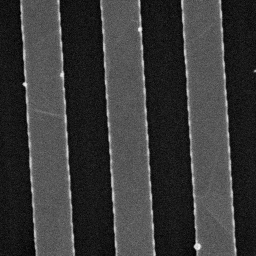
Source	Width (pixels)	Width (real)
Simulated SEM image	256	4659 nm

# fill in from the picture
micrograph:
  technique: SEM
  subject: lines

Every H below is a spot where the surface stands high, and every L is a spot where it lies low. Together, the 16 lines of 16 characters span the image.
LHHHLLHHHLLHHHLL
LHHHLLHHHLLHHHLL
LHHHLLHHHLLHHHLL
LHHHLLHHHLLLHHLL
LLHHLLLHHLLLHHLL
LLHHLLLHHLLLHHLL
LLHHLLLHHLLLHHLL
LLHHLLLHHLLLHHLL
LLHHLLLHHLLLHHLL
LLHHLLLHHLLLHHLL
LLHHLLLHHLLLHHLL
LLHHLLLHHLLLHHLL
LLHHLLLHHLLLHHHL
LLHHLLLHHHLLHHHL
LLHHHLLHHHLLHHHL
LLHHHLLHHHLLHHHL